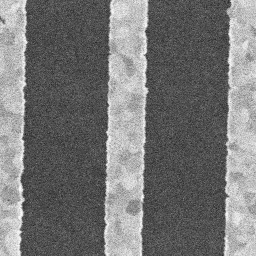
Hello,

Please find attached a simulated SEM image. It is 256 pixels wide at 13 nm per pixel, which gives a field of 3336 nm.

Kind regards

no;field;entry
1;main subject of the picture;one or a few lines or trenches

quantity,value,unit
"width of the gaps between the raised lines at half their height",84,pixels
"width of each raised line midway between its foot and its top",467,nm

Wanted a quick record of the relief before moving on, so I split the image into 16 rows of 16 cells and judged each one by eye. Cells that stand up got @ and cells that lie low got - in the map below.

@@-----@@-----@@
@@-----@@-----@@
@------@@-----@@
@------@@-----@@
@------@@------@
@@-----@@-----@@
@@-----@@-----@@
@------@@-----@@
@------@@-----@@
@------@@-----@@
@------@@-----@@
@------@@------@
@-------@-----@@
@------@@-----@@
@------@@-----@@
@------@@-----@@